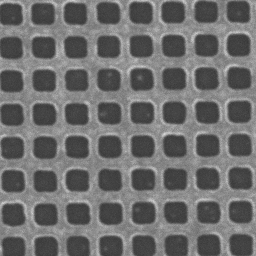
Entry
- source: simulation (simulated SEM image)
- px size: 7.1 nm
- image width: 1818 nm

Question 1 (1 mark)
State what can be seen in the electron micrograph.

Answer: a regular array of holes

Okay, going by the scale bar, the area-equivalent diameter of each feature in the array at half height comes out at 187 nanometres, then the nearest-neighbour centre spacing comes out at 229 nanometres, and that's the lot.